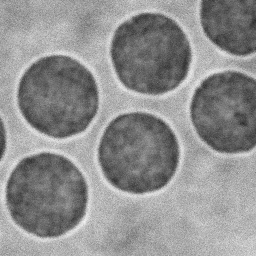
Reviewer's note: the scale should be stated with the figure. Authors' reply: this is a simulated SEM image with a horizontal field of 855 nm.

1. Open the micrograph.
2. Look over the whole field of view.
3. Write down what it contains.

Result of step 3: holes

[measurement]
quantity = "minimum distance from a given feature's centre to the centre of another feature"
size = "330 nanometres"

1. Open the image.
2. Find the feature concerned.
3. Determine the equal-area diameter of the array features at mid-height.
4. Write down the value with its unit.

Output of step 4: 83.5 px